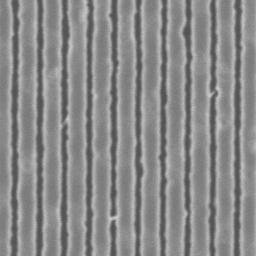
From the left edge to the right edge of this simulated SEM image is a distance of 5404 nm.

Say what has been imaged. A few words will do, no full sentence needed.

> parallel lines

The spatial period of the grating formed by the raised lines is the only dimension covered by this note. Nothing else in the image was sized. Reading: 0.522 microns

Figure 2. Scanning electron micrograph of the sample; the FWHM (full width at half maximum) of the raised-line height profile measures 377 nanometers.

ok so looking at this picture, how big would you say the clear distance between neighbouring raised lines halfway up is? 140 nm